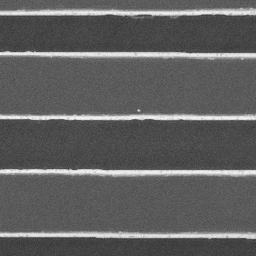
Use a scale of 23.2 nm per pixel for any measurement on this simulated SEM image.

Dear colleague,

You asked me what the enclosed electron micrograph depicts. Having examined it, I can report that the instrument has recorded lines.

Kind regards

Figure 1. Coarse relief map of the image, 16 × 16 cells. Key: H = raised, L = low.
HHHHHHHHHHHHHHHH
LLLLLLLLLLLLLLLL
LLLLLLLLLLLLLLLL
HHHHHHHHHHHHHHHH
HHHHHHHHHHHHHHHH
HHHHHHHHHHHHHHHH
HHHHHHHHHHHHHHHH
LLLLLLLLLLLLLLLL
LLLLLLLLLLLLLLLL
LLLLLLLLLLLLLLLL
LLLLLLLLLLLLLLLL
HHHHHHHHHHHHHHHH
HHHHHHHHHHHHHHHH
HHHHHHHHHHHHHHHH
HHHHHHHHHHHHHHHH
LLLLLLLLLLLLLLLL